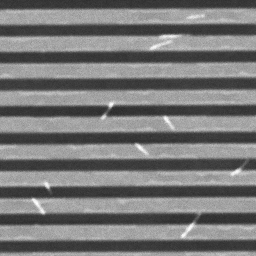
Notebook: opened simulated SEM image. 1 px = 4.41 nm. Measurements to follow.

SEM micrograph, parallel lines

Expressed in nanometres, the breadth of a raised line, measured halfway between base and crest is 71.7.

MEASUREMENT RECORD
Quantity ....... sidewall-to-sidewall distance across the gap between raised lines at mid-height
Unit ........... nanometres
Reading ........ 47.4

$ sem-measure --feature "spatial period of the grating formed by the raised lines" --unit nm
119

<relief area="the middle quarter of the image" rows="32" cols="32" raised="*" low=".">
********************************
********************************
********************************
************************........
................................
................................
.............*******************
********************************
********************************
********************************
...........*....................
................................
................................
********************************
********************************
********************************
********************************
................................
................................
................................
********************************
********************************
********************************
********************************
................................
................................
................................
********************************
********************************
********************************
**********************..........
................................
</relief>